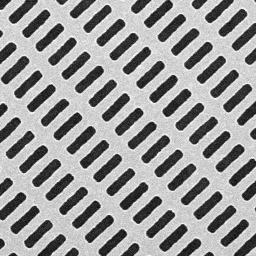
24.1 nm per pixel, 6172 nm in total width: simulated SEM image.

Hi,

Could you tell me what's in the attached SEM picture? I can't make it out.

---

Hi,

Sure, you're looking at a regular array of holes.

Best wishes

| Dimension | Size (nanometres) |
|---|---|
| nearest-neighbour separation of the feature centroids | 462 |